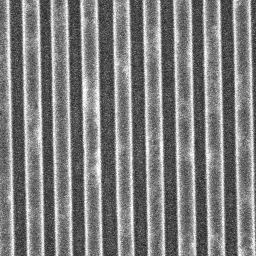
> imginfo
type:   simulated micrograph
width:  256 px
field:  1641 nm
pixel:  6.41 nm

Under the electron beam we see parallel lines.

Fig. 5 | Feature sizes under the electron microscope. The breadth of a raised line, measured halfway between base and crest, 103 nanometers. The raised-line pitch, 193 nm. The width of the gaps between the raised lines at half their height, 92.1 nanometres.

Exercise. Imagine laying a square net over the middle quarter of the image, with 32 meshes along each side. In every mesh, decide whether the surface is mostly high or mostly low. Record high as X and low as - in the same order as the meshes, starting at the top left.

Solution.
X----XXX-----XXX----XXXX----XXXX
X----XXX-----XXXX---XXXX----XXXX
X----XXX-----XXXX---XXXX----XXXX
X----XXXX----XXXX---XXXX----XXXX
X----XXXX----XXXX---XXXX----XXXX
X----XXXX----XXXX---XXXX----XXXX
X----XXXX----XXXX---XXXX----XXXX
X----XXXX----XXX----XXXX----XXXX
X----XXXX----XXXX---XXXX----XXXX
X----XXXX----XXXX---XXXX----XXXX
X----XXXX----XXXX----XXX----XXXX
X----XXXX----XXXX----XXX----XXXX
X----XXXX----XXXX----XXX----XXXX
X----XXXX----XXXX----XXX----XXXX
X----XXXX----XXXX----XXX----XXXX
X----XXXX----XXXX----XXX----XXXX
X----XXXX----XXXX----XXX----XXXX
X----XXXX----XXXX----XXX----XXXX
X----XXXX----XXXX----XXX----XXXX
X----XXXX----XXXX----XXX----XXXX
X----XXXX----XXXX----XX-----XXXX
X----XXXX----XXXX----XX-----XXXX
X----XXXX----XXXX----XX-X---XXXX
XX---XXXX----XXXX----XXXX---XXXX
XX---XXXX----XXXX----XXXX---XXXX
XX---XXXX----XXXX----XXXX---XXXX
XX---XXXX----XXXX----XXXX---XXXX
XX---XXXX----XXXX----XXXX---XXXX
XX---XXXX----XXXX----XXXX---XXXX
XX---XXXX----XXXX----XXXX---XXXX
XX---XXXX----XXXX----XXXX---XXXX
XX---XXXX----XXXX----XXXX----XXX